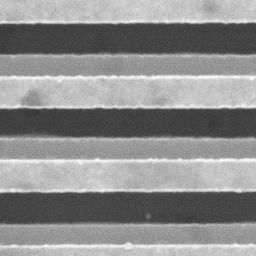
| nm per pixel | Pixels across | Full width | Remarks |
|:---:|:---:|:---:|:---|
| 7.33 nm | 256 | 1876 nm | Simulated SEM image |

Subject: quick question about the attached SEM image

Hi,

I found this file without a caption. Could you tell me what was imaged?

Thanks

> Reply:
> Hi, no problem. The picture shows lines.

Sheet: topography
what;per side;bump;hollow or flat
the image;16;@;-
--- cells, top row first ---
@@@@@@@@@@@@@@@@
----------------
----------------
@@@@@@@@@@@@@@@@
@@@@@@@@@@@@@@@@
@@@@@@@@@@@@@@@@
@@@@@@@@@@@@@@@@
----------------
----------------
@@@@@@@@@@@@@@@@
@@@@@@@@@@@@@@@@
@@@@@@@@@@@@@@@@
----------------
----------------
@@@@@@@@@@@@@@@@
@@@@@@@@@@@@@@@@